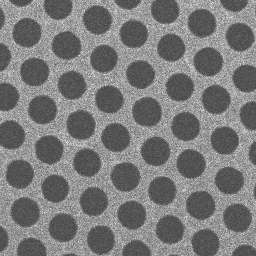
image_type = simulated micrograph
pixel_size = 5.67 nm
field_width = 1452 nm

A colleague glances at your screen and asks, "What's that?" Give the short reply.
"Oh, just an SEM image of a regular array of holes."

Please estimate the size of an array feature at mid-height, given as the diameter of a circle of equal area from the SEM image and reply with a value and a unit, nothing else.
162 nanometres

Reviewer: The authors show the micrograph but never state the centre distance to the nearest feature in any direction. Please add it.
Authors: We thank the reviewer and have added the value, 218 nanometers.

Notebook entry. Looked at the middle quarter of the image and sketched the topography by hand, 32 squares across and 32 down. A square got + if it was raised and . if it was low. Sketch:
+++++++......+++......++++++++++
++++++++....++++......++++++++++
....+++++++++++........+++++..++
.....+++++++++++.......+++.....+
.....+++++++++++......++++......
......++++..+++++....+++++......
.....+++......++++++++++++......
.....+++.......+++++++++++......
+...++++.......+++++..+++++....+
++++++++.......+++.....+++++++++
++++++++.......++.......++++++++
+++++++++.....+++.......++++++++
++.....++++++++++.......+++++...
+......++++++++++.......+++.....
+.......++++++++++......+++.....
+.......+++....+++++...++++.....
+.......++......+++++++++++.....
+......++.......+++++++++++.....
++....+++........+++++..++++....
+++++++++........+++......++++++
++++++++++......++++......++++++
++++...++++....++++........+++..
+++.....+++++++++++.......+++...
+++......+++++++++++......++....
++.......+++++++++++......++....
++.......++++.....++++++++++....
+++......+++......+++++++++++...
++++....++++.......++++++++++...
++++++++++++.......++++...+++++.
.+++++++++++.......+++.....+++++
.++++++++++++.....+++.......++++
.++++.....++++...++++.......++++